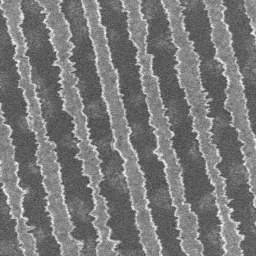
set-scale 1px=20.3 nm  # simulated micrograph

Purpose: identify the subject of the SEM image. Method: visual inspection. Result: parallel lines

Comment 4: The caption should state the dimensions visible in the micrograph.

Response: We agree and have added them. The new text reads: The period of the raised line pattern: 807 nanometres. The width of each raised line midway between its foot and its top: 0.307 microns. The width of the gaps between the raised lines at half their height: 497 nanometres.